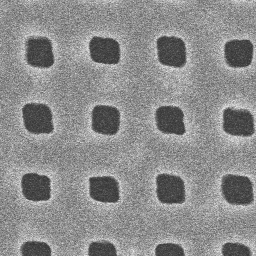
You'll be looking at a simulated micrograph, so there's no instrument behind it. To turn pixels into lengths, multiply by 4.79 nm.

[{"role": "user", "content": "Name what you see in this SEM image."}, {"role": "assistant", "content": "a regular array of holes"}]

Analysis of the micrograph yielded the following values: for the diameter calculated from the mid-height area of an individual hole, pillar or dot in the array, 144 nanometres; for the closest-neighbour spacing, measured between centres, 316 nm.